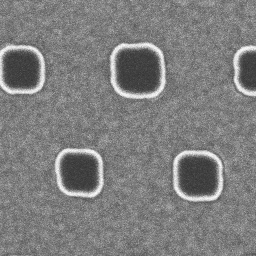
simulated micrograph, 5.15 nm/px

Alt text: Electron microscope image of raised bodies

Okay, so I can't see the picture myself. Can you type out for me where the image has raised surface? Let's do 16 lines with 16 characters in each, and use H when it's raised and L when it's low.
LLLLLLLLLLLLLLLL
LLLLLLLLLLLLLLLL
LLLLLLLLLLLLLLLL
HHHLLLLHHHLLLLLH
HHHLLLLHHHLLLLLH
HHLLLLLHHHLLLLLH
LLLLLLLLLLLLLLLL
LLLLLLLLLLLLLLLL
LLLLLLLLLLLLLLLL
LLLLHHLLLLLLLLLL
LLLLHHLLLLLHHHLL
LLLLHHLLLLLHHHLL
LLLLLLLLLLLLLLLL
LLLLLLLLLLLLLLLL
LLLLLLLLLLLLLLLL
LLLLLLLLLLLLLLLL